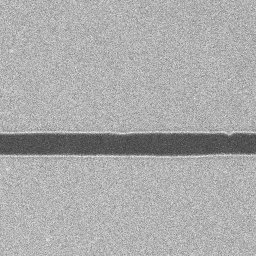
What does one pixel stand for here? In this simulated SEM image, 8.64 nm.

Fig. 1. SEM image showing one or a few lines or trenches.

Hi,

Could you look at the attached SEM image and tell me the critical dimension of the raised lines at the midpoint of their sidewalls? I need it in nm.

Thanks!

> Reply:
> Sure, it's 211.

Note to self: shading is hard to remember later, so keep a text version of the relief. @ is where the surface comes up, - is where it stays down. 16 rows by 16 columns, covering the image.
----------------
----------------
----------------
----------------
----------------
----------------
----------------
----------------
@@@@@@@@@@@@@@@@
@@@@@@@@@@@@@@@@
----------------
----------------
----------------
----------------
----------------
----------------